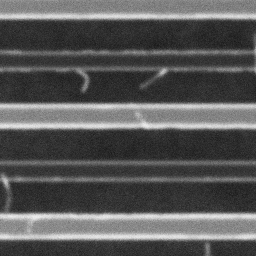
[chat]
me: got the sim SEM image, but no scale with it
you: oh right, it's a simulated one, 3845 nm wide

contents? lines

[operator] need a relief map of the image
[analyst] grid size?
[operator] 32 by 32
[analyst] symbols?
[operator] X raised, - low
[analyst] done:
XXXXXXXXXXXXXXXXXXXXXXXXXXXXXXXX
XXXXXXXXXXXXXXXXXXXXXXXXXXXXXXXX
--------------------------------
--------------------------------
--------------------------------
--------------------------------
XXX-----X-XXXX-XXX-XXXXXXXXXXXXX
XXXXXXXXXXXXXXXXXXXXXXXXXXXXXXXX
XXXXXXXXXXXXXXXXXXXXXXXXXXXXXXXX
--------------------------------
--------------------------------
--------------------------------
--------------------------------
XXXXXXXXXXXXXXXXXXXXXXXXXXXXXXXX
XXXXXXXXXXXXXXXXXXXXXXXXXXXXXXXX
XXXXXXXXXXXXXXXXXXXXXXXXXXXXXXXX
--------------------------------
--------------------------------
--------------------------------
--------------------------------
XXXXXXXXXXXXXXXXXXXXXXXXXXXXXXXX
XXXXXXXXXXXXXXXXXXXXXXXXXXXXXXXX
XXXXXXXXXXXXXXXXXXXXXXXXXXXXXXXX
--------------------------------
--------------------------------
--------------------------------
--------------------------------
XXXXXXXXXXXXXXXXXXXXXXXXXXXXXXXX
XXXXXXXXXXXXXXXXXXXXXXXXXXXXXXXX
XXXXXXXXXXXXXXXXXXXXXXXXXXXXXXXX
--------------------------------
--------------------------------